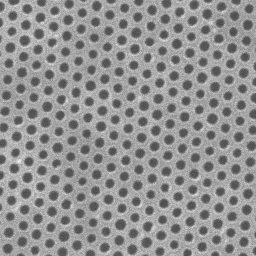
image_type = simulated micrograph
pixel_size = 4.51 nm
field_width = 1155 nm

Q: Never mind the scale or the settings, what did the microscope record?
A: a regular array of holes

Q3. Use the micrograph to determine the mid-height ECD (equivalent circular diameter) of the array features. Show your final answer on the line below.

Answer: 43.8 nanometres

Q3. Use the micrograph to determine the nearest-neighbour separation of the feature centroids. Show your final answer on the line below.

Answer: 70.9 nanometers